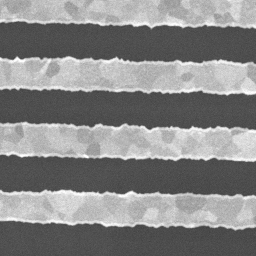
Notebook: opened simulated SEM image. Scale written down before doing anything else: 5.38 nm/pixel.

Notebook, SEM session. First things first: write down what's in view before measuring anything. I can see lines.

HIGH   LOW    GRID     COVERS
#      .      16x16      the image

################
......##########
................
................
################
################
................
................
################
################
................
................
################
################
................
................